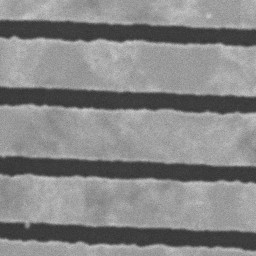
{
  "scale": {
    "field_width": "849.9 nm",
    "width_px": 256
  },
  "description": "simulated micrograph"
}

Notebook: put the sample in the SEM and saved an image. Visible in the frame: lines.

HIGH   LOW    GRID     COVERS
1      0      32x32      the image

11111111111111111111111111111111
11111111111111111111111111111111
00000011111111111111111111111111
00000000000000000000000000000111
00000000000000000000000000000000
11111111111111111111100000000000
11111111111111111111111111111111
11111111111111111111111111111111
11111111111111111111111111111111
11111111111111111111111111111111
11111111111111111111111111111111
00000000000000000000011111111111
00000000000000000000000000000000
11111111010000000000000000000000
11111111111111111111111111111111
11111111111111111111111111111111
11111111111111111111111111111111
11111111111111111111111111111111
11111111111111111111111111111111
00011111111111111111111111111111
00000000000000000000000001111111
00000000000000000000000000000000
11111111111111111111100000000000
11111111111111111111111111111111
11111111111111111111111111111111
11111111111111111111111111111111
11111111111111111111111111111111
11111111111111111111111111111111
00000000000000000000011111111111
00000000000000000000000000000000
11111111111000000000000000000000
11111111111111111111111111111111